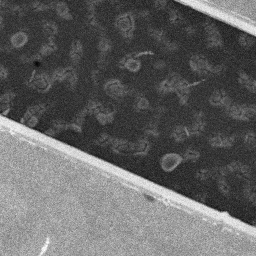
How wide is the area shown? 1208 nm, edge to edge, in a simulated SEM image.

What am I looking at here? one or a few lines or trenches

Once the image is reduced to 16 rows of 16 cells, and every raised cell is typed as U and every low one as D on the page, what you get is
DDDDDDDDDDDDDUUU
DDDDDDDDDDDDDDDU
DDDDDDDDDDDDDDDD
DDDDDDDDDDDDDDDD
DDDDDDDDDDDDDDDD
DDDDDDDDDDDDDDDD
DDDDDDDDDDDDDDDD
DDDDDDDDDDDDDDDD
UUDDDDDDDDDDDDDD
UUUUUDDDDDDDDDDD
UUUUUUUDDDDDDDDD
UUUUUUUUUDDDDDDD
UUUUUUUUUUUDDDDD
UUUUUUUUUUUUUUDD
UUUUUUUUUUUUUUUU
UUUUUUUUUUUUUUUU